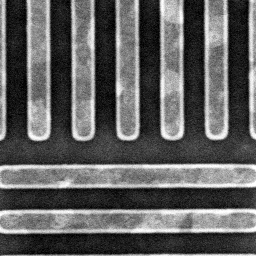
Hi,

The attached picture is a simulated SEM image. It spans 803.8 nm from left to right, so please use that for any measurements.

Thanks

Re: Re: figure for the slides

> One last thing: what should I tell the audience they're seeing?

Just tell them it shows groups of lines, slits or small figures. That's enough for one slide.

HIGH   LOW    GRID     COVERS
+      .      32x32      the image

....++...++....++...+++...++...+
....++...++....++...+++...++...+
....++...+++...++...+++...++...+
....++...+++...++...+++...++...+
....++...+++...++...+++...++...+
....++...+++...++...+++...++...+
....++...+++...++...+++...++...+
....++...+++...++...+++...++...+
+...++...+++...++...+++...++...+
+...++...+++...++...+++...++...+
+...++...+++...++...+++...++...+
+...++...+++...++...+++...++...+
+...++...+++...++...+++...++...+
+...++...+++...++...+++...++...+
+...++...+++...++...+++...++...+
+...++...+++...++...+++...++...+
+...++...+++...++...+++...++...+
................................
................................
................................
................................
++++++++++++++++++++++++++++++++
++++++++++++++++++++++++++++++++
................................
................................
................................
..++++++++++++++++++++++++++++++
++++++++++++++++++++++++++++++++
++++++++++++++++++++++++++++++++
................................
................................
................................